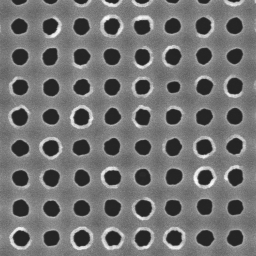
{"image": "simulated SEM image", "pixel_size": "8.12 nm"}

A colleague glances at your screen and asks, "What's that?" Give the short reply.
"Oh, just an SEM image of a regular array of holes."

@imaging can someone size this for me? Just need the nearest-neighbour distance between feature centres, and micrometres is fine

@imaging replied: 0.243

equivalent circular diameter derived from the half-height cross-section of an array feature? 134 nm